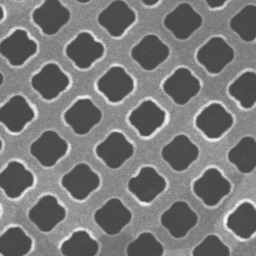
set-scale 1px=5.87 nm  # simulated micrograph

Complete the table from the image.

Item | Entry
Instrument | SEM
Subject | a regular array of holes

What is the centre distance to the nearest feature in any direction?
269 nm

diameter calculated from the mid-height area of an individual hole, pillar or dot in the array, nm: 199